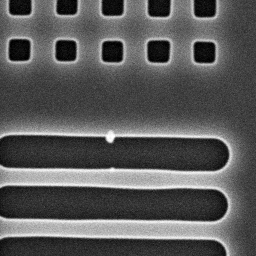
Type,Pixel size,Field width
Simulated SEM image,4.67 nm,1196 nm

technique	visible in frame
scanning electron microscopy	groups of lines, slits or small figures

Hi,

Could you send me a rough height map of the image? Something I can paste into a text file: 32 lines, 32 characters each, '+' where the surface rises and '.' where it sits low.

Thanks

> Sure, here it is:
+...+++...+++...++...+++...+++++
+...+++...+++..+++...+++...+++++
++++++++++++++++++++++++++++++++
++++++++++++++++++++++++++++++++
++++++++++++++++++++++++++++++++
+...+++...+++..+++...+++...+++++
+...+++...+++...++...+++...+++++
+...+++..++++..++++..+++...+++++
++++++++++++++++++++++++++++++++
++++++++++++++++++++++++++++++++
++++++++++++++++++++++++++++++++
++++++++++++++++++++++++++++++++
++++++++++++++++++++++++++++++++
++++++++++++++++++++++++++++++++
++++++++++++++++++++++++++++++++
++++++++++++++++++++++++++++++++
++++++++++++++++++++++++++++++++
............................++++
.............................+++
.............................+++
............................++++
+++++++++++++++++++++++....+++++
++++++++++++++++++++++++++++++++
..........................++++++
............................++++
.............................+++
............................++++
+..........................+++++
++++++++++++++++++++++++++++++++
++.....+++++++++++++++++++++++++
............................++++
............................++++